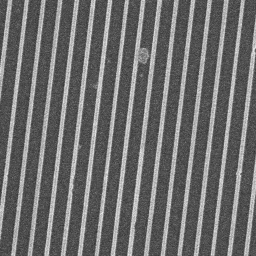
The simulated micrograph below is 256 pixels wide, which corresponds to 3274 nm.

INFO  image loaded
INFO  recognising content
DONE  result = parallel lines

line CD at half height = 44.5 nanometres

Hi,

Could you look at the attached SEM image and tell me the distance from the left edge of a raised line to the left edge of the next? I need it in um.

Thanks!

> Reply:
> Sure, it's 0.211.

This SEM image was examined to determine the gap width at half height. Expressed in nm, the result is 167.